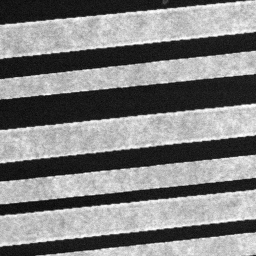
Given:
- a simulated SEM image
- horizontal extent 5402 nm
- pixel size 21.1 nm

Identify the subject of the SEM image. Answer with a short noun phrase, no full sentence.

lines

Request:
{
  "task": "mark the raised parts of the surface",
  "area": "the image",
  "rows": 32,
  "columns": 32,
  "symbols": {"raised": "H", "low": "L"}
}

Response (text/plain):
LLLLLLLLLLLLLLLLLLLLLLLLLLLLHHHH
LLLLLLLLLLLLLLLLLLHHHHHHHHHHHHHH
LLLLLLLHHHHHHHHHHHHHHHHHHHHHHHHH
HHHHHHHHHHHHHHHHHHHHHHHHHHHHHHHH
HHHHHHHHHHHHHHHHHHHHHHHHHHHLLLLL
HHHHHHHHHHHHHHHHLLLLLLLLLLLLLLLL
HHHHHHHLLLLLLLLLLLLLLLLLLLLLLLLH
LLLLLLLLLLLLLLLLLLLLLLHHHHHHHHHH
LLLLLLLLLLLLLHHHHHHHHHHHHHHHHHHH
LLLLHHHHHHHHHHHHHHHHHHHHHHHHLLLL
HHHHHHHHHHHHHHHHHHHLLLLLLLLLLLLL
HHHHHHHHHLLLLLLLLLLLLLLLLLLLLLLL
LLLLLLLLLLLLLLLLLLLLLLLLLLLLLLLL
LLLLLLLLLLLLLLLLLLLLLLLLLLLLHHHH
LLLLLLLLLLLLLLLLLLHHHHHHHHHHHHHH
LLLLLLLLHHHHHHHHHHHHHHHHHHHHHHHH
HHHHHHHHHHHHHHHHHHHHHHHHHHHHHHHH
HHHHHHHHHHHHHHHHHHHHHHHHHHLLLLLL
HHHHHHHHHHHHHHHHLLLLLLLLLLLLLLLL
HHHHHHHLLLLLLLLLLLLLLLLLLLLLLLLH
LLLLLLLLLLLLLLLLLLLLLHHHHHHHHHHH
LLLLLLLLLLLLHHHHHHHHHHHHHHHHHHHH
LLLHHHHHHHHHHHHHHHHHHHHHHHHHHLLL
HHHHHHHHHHHHHHHHHHHLLLLLLLLLLLLL
HHHHHHHHHHLLLLLLLLLLLLLLLHHHHHHH
LLLLLLLLLLLLLLLHHHHHHHHHHHHHHHHH
LLLLLLHHHHHHHHHHHHHHHHHHHHHHHHHH
HHHHHHHHHHHHHHHHHHHHHHHHHHHHHLLL
HHHHHHHHHHHHHHHHHHHHLLLLLLLLLLLL
HHHHHHHHHHHLLLLLLLLLLLLLLLLLHHHH
HHLLLLLLLLLLLLLLLLLHHHHHHHHHHHHH
LLLLLLLLLLHHHHHHHHHHHHHHHHHHHHHH